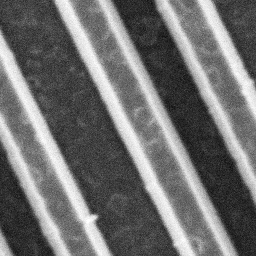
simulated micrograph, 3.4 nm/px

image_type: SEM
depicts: one or a few lines or trenches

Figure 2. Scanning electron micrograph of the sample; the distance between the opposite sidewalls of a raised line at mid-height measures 133 nm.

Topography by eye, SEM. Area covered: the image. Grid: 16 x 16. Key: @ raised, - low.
----@@@---@@@---
-----@@----@@---
-----@@@---@@@--
------@@----@@--
@-----@@@---@@@-
@------@@----@@@
@@-----@@@---@@@
@@------@@----@@
@@@-----@@@---@@
-@@------@@----@
-@@@-----@@@---@
--@@-----@@@----
--@@@-----@@@---
---@@-----@@@---
---@@@-----@@@--
----@@-----@@@--